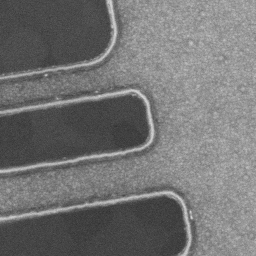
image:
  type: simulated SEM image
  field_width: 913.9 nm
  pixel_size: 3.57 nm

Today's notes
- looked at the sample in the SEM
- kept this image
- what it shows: one or a few lines or trenches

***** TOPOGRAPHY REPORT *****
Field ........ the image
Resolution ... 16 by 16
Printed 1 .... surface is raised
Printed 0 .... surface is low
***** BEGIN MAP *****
1111111000000000
1111111000000000
1111111000000000
1111110000000000
1110000000000000
0000000000000000
0001111110000000
1111111110000000
1111111111000000
1111111100000000
1100000000000000
0000000000000000
0000000111100000
0111111111110000
1111111111110000
1111111111110000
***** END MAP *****